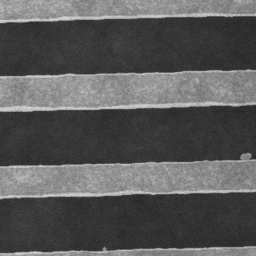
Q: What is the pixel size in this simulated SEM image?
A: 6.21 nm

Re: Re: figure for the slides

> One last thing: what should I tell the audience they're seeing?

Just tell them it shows lines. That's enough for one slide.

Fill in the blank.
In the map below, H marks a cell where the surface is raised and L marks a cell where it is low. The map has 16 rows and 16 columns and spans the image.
HHHHHHHHHHHHHHHH
LLLLLLLLLLLLLLLL
LLLLLLLLLLLLLLLL
LLLLLLLLLLLLLLLL
LLLLLLLLLLLHHHHH
HHHHHHHHHHHHHHHH
HHHHHHHHHHHHHHHH
LLLLLLLLLLLLLLLL
LLLLLLLLLLLLLLLL
LLLLLLLLLLLLLLLL
HHHHHHHHHHHHHHHH
HHHHHHHHHHHHHHHH
LLLLLLLLLLLLLLLL
LLLLLLLLLLLLLLLL
LLLLLLLLLLLLLLLL
LLLLLLLLLLLLLHHH